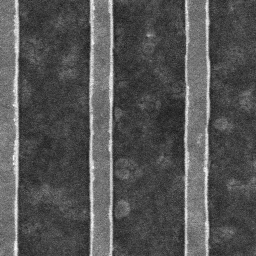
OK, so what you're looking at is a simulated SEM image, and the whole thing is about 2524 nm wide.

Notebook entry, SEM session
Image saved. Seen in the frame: one or a few lines or trenches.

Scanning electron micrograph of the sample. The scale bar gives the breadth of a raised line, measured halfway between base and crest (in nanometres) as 200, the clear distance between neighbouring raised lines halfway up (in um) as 0.736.